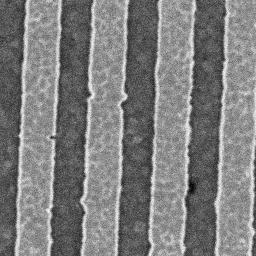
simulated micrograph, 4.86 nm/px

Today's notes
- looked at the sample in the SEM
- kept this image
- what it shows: one or a few lines or trenches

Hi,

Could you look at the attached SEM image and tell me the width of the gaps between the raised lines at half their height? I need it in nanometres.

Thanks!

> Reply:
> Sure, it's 164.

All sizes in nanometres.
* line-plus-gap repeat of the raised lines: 324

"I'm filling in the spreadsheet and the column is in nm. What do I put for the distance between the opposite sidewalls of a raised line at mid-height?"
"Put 160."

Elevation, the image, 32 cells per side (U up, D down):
DDDUUUUUDDDDUUUUDDDDUUUUDDDDUUUU
DDDUUUUDDDDDUUUUDDDDUUUUDDDDUUUU
DDDUUUUDDDDDUUUUDDDDUUUUDDDDUUUU
DDDUUUUUDDDDUUUUDDDDUUUUDDDDUUUU
DDDUUUUDDDDDUUUUDDDDUUUUDDDDUUUU
DDDUUUUDDDDDUUUUDDDDUUUUDDDDUUUU
DDDUUUUDDDDUUUUUDDDDUUUUDDDDUUUU
DDDUUUUDDDDUUUUUDDDDUUUUDDDDUUUU
DDDUUUUDDDDUUUUUDDDDUUUUDDDDUUUU
DDDUUUUDDDDUUUUUDDDUUUUUDDDDUUUU
DDDUUUUDDDDUUUUDDDDDUUUUDDDDUUUU
DDDUUUUDDDDUUUUDDDDDUUUUDDDDUUUU
DDDUUUUDDDDUUUUDDDDDUUUUDDDDUUUU
DDDUUUUDDDDUUUUDDDDDUUUUDDDDUUUU
DDDUUUUDDDDUUUUDDDDUUUUUDDDDUUUU
DDDUUUUDDDDUUUUDDDDUUUUDDDDDUUUU
DDDUUUUDDDDUUUUDDDDUUUUUDDDDUUUU
DDDUUUDDDDDUUUUDDDDUUUUDDDDDUUUU
DDDUUUUDDDDUUUUDDDDUUUUDDDDDUUUU
DDDUUUUDDDDUUUUDDDDUUUUDDDDDUUUU
DDUUUUUDDDDUUUUDDDDUUUUDDDDUUUUU
DDDUUUUDDDDUUUUDDDDUUUUDDDDUUUUU
DDUUUUDDDDDUUUUDDDDUUUUDDDDUUUUU
DDUUUUDDDDDUUUUDDDDUUUUDDDDUUUUU
DDUUUUDDDDUUUUUDDDDUUUUDDDDUUUUU
DDUUUUDDDDUUUUUDDDDUUUUDDDDUUUUU
DDUUUUDDDDDUUUUDDDDUUUUDDDDUUUUU
DDUUUUDDDDUUUUUDDDDUUUUDDDDUUUUD
DDUUUUDDDDUUUUUDDDDUUUUDDDDUUUUD
DDUUUUDDDDUUUUUDDDDUUUUDDDDUUUUU
DDUUUUDDDDUUUUUDDDDUUUUDDDDUUUUD
DDUUUUDDDDUUUUUDDDDUUUUDDDDUUUUD